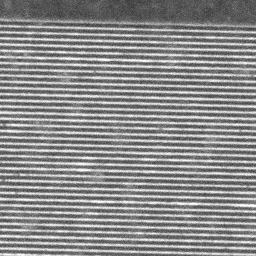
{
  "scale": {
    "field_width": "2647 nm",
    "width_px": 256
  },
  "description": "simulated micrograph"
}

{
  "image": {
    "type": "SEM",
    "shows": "parallel lines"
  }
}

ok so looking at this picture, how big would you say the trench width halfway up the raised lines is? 51.7 nanometers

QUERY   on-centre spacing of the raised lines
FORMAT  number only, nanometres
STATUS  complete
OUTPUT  63.9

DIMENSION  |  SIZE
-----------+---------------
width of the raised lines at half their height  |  10.3 nm